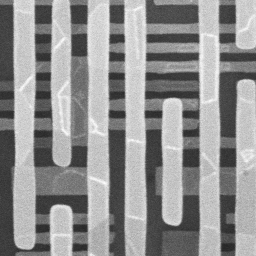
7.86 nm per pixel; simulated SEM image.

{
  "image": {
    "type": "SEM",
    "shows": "wiring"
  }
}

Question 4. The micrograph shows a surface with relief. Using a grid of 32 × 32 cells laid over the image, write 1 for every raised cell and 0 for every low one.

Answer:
00110001100111001100000001100011
00110001100111001100000001100011
00110001100111001100000001100011
00110001100111001100000001100011
00110001100111001100000001100011
00110001100111001100000001100011
00110001100111001100000001100000
00110001100111001100000001100000
00110001100111001100000001100000
00110001100110001100000001100000
00110011100111001100000001100011
00110011100111001100000001100011
00110001100111001100010001100011
00110001100111001100111001100011
00110001100111001100111001100011
00110001100110001100111001100011
00110001100110001100111001100011
00110001100111001100111001100011
00110001100111001100111001100011
00110001100111001100111001100011
00110001100111001100111001100011
00110000000111001100111001100011
00110000000111001100111001100011
00110000000111001100111001100011
00110000000111001100111001100011
00110000000111001100111001100011
00110011100111001100111001100111
00110011100111001100011001100111
00110011100111001100000001100111
00110011100111001100000001100011
00110011100111001100000001100011
00000011100111001100000001100011